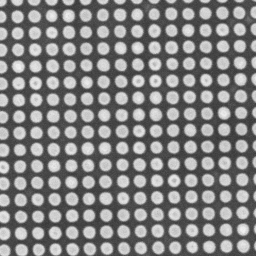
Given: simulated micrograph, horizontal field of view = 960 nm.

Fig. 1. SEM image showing a regular array of raised bodies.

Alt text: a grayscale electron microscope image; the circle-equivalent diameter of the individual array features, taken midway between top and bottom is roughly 43.6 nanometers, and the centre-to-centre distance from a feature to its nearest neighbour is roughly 62.2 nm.